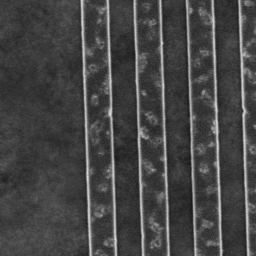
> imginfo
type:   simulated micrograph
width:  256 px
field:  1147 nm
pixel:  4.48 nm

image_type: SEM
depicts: parallel lines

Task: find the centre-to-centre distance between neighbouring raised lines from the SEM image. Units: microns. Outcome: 0.235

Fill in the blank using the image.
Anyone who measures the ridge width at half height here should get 119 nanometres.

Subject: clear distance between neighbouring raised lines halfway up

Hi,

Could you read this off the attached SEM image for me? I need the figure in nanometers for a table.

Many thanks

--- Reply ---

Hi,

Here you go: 115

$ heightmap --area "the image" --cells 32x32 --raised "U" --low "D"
DDDDDDDDDDUUUDDDDUUUDDDUUUUDDDUU
DDDDDDDDDDUUUUDDDUUUDDDUUUUDDDUU
DDDDDDDDDDUUUUDDDUUUDDDUUUUDDDUU
DDDDDDDDDDUUUUDDDUUUDDDUUUUDDDUU
DDDDDDDDDDUUUUDDDUUUDDDUUUUDDDUU
DDDDDDDDDDUUUUDDDUUUDDDDUUUDDDUU
DDDDDDDDDDUUUUDDDUUUDDDDUUUDDDUU
DDDDDDDDDDUUUUDDDUUUDDDDUUUDDDUU
DDDDDDDDDDDUUUDDDUUUDDDDUUUDDDUU
DDDDDDDDDDUUUUDDDUUUDDDDUUUDDDUU
DDDDDDDDDDDUUUDDDUUUDDDDUUUDDDUU
DDDDDDDDDDDUUUDDDUUUDDDDUUUDDDUU
DDDDDDDDDDDUUUDDDUUUDDDDUUUDDDUU
DDDDDDDDDDDUUUDDDUUUDDDDUUUDDDUU
DDDDDDDDDDDUUUDDDUUUDDDDUUUDDDUU
DDDDDDDDDDDUUUDDDUUUUDDDUUUDDDUU
DDDDDDDDDDDUUUDDDUUUUDDDUUUDDDUU
DDDDDDDDDDDUUUDDDUUUUDDDUUUDDDUU
DDDDDDDDDDDUUUDDDUUUUDDDUUUDDDDU
DDDDDDDDDDDUUUDDDUUUUDDDUUUDDDDU
DDDDDDDDDDDUUUDDDUUUUDDDUUUDDDDU
DDDDDDDDDDDUUUDDDUUUUDDDUUUDDDDU
DDDDDDDDDDDUUUDDDDUUUDDDUUUDDDDU
DDDDDDDDDDDUUUDDDDUUUDDDUUUDDDDU
DDDDDDDDDDDUUUDDDDUUUDDDUUUDDDDU
DDDDDDDDDDDUUUDDDDUUUDDDUUUDDDDU
DDDDDDDDDDDUUUDDDDUUUDDDUUUDDDDU
DDDDDDDDDDDUUUDDDDUUUDDDUUUDDDDU
DDDDDDDDDDDUUUDDDDUUUDDDUUUUDDDU
DDDDDDDDDDDUUUDDDDUUUDDDUUUUDDDU
DDDDDDDDDDDUUUDDDDUUUDDDUUUUDDDU
DDDDDDDDDDDUUUUDDDUUUDDDUUUUDDDU